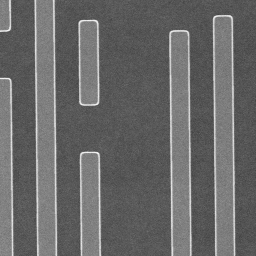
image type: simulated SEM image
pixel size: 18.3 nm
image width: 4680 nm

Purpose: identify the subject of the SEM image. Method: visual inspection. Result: groups of lines, slits or small figures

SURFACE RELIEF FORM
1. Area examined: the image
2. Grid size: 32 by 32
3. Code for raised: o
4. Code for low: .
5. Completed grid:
o...ooo.........................
o...ooo.........................
o...ooo....................oo...
o...ooo...oo...............oo...
....ooo...oo.........ooo...oo...
....ooo...oo.........ooo...oo...
....ooo...oo.........ooo...oo...
....ooo...oo.........ooo...oo...
.....oo...oo.........ooo...oo...
.....oo...oo.........ooo...oo...
o....oo...oo.........ooo...oo...
o....oo...oo.........ooo...oo...
o....oo...oo.........ooo...oo...
o....oo..............ooo...oo...
o....oo..............ooo...oo...
o....oo..............ooo...oo...
o....oo..............ooo...oo...
o....oo..............ooo...oo...
o....oo..............ooo...oo...
o....oo...oo.........ooo...oo...
o....oo...oo.........ooo...oo...
o....oo...oo.........ooo...oo...
o....oo...oo.........ooo...oo...
o....oo...oo.........ooo...oo...
oo...oo...oo.........ooo...oo...
oo...oo...oo.........ooo...oo...
oo...oo...oo.........ooo...oo...
oo...oo...oo.........ooo...oo...
oo...oo...oo.........ooo...oo...
oo...oo...oo.........ooo...oo...
oo...oo...ooo.........oo...oo...
oo...oo...ooo.........oo...oo...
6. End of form